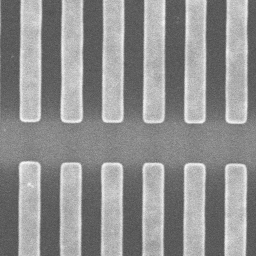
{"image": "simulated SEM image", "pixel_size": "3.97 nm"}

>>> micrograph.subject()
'groups of lines, slits or small figures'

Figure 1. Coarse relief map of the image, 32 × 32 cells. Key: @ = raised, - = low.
---@@---@@---@@---@@@--@@@--@@@-
---@@---@@---@@---@@@--@@@--@@@-
---@@---@@---@@---@@@--@@@--@@@-
---@@---@@---@@---@@@--@@@--@@@-
---@@---@@---@@---@@@--@@@--@@@-
---@@---@@---@@---@@@--@@@--@@@-
---@@---@@---@@---@@@--@@@--@@@-
---@@---@@---@@---@@@--@@@--@@@-
---@@---@@---@@---@@@--@@@--@@@-
---@@---@@---@@---@@@--@@@--@@@-
---@@---@@---@@---@@@--@@@--@@@-
---@@---@@---@@---@@@--@@@--@@@-
---@@---@@---@@---@@@--@@@--@@@-
---@@---@@---@@---@@@--@@@--@@@-
---@@---@@---@@---@@@--@@@--@@@-
--------------------------------
--------------------------------
--------------------------------
--------------------------------
--------------------------------
---@@---@@---@@---@@----@-------
--@@@---@@---@@---@@---@@@--@@@-
---@@---@@---@@---@@---@@@--@@@-
--@@@---@@---@@---@@---@@@--@@@-
--@@@---@@---@@---@@---@@@--@@@-
--@@@---@@---@@---@@---@@@--@@@-
--@@@---@@---@@---@@---@@@--@@@-
--@@@---@@---@@---@@---@@@--@@@-
--@@@---@@---@@---@@---@@@--@@@-
--@@@---@@---@@---@@---@@@--@@@-
--@@@---@@---@@---@@---@@@--@@@-
--@@@---@@---@@---@@---@@@--@@@-